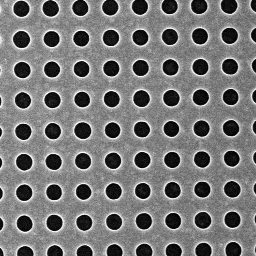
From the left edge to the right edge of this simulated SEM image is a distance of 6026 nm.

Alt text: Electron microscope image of a regular array of holes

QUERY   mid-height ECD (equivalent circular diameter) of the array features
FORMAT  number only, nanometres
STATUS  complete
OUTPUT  391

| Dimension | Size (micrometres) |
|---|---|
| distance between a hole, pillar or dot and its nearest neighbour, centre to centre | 0.694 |